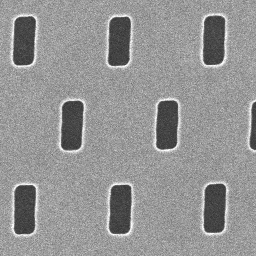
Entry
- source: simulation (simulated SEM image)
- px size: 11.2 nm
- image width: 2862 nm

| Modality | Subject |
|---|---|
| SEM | a regular array of holes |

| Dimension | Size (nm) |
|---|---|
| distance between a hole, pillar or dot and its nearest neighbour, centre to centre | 1060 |